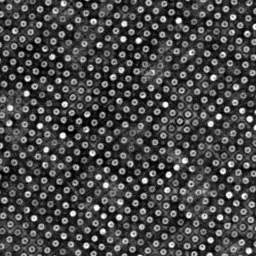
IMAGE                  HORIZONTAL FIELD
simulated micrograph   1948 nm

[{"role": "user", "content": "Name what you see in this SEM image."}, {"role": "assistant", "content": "a regular array of raised bodies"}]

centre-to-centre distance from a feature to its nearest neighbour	81.4	nanometres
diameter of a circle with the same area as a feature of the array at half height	5.64	pixels